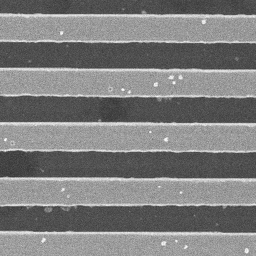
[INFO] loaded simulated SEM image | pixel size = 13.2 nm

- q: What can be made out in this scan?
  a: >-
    lines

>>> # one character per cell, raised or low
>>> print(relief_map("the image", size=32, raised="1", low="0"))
00000000000000000000000000000000
00000000000000000000000000000000
11111111111111111111111111111111
11111111111111111111111111111111
11111111111111111111111111111111
00000000000000000000000000000000
00000000000000000000000000000000
00000000000000000000000000000000
00000000000000000000000000000000
11111111111111111111111111111111
11111111111111111111111111111111
11111111111111111111111111111111
00000000000000000000000000000000
00000000000000000000000000000000
00000000000000000000000000000000
11111111111111111111111111111111
11111111111111111111111111111111
11111111111111111111111111111111
11111111111111111111111111111111
00000000000000000000000000000000
00000000000000000000000000000000
00000000000000000000000000000000
11111111111111111111111111111111
11111111111111111111111111111111
11111111111111111111111111111111
11111111111111111111111111111111
00000000000000000000000000000000
00000000000000000000000000000000
00000000000000000000000000000000
11111111111111111111111111111111
11111111111111111111111111111111
11111111111111111111111111111111